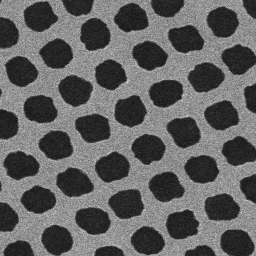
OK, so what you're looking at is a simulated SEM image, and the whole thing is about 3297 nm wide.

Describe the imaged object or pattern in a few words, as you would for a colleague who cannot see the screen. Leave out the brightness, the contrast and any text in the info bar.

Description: a regular array of holes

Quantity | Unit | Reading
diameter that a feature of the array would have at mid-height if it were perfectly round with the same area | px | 31.1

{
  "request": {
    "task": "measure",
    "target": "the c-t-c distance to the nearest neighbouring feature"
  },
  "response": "511 nanometres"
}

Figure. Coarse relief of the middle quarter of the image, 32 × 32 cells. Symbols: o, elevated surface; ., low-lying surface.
oooooooo......ooooo......ooooooo
oooooooo.......oooooo.oooooooooo
oooooooo.......oooooooooooooooo.
....oooo........ooooooooooooooo.
......oo.......ooooooooo.....oo.
.......oo.....oooooooo........oo
.......oooo.ooooooooo.........oo
.......oooooooooooooo.........oo
......oooooooooo...oo........ooo
......ooooooo.......oo......oooo
oo..ooooooooo.......ooo...oooooo
ooooooooooooo........ooooooooooo
ooooooo.ooooo........ooooooooooo
ooo.......ooo.......oooooooo.o..
ooo........oo.......oooooo......
ooo........oooo...oooooooo......
ooo.........oooooooooooooo......
.ooo........oooooooo.oooooo.....
.oooo......ooooooo......ooo.....
..oooo..ooooooooo........ooo....
..ooooooooooooooo........ooo....
..ooooooooooooooo........ooooooo
..ooooooooo...oooo.......ooooooo
ooooooooo......ooo.......ooooooo
oooooooo........ooo...ooooooooo.
oooooooo........oooooooooooooo..
o...oooo........oooooooooooooo..
.....ooo........oooooooo....ooo.
......ooo......ooooooo.......ooo
.......ooo..ooooooooo........ooo
.......oooooooooooooo.........oo
.......ooooooooo..ooo.........oo